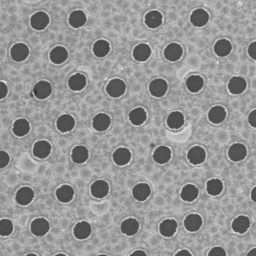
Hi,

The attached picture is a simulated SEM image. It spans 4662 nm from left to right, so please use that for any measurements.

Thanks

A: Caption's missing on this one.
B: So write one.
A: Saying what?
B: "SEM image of a regular array of holes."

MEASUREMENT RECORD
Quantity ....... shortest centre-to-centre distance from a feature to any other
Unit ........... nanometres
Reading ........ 642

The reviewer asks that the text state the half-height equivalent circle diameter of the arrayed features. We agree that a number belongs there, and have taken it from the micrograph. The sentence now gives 336 nanometres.